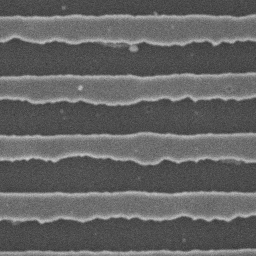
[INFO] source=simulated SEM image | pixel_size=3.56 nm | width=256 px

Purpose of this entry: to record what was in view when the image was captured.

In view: lines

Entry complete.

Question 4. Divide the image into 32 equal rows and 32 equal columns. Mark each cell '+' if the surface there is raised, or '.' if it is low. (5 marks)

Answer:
................................
................................
++++++++++++++++++++++++++++++++
++++++++++++++++++++++++++++++++
++++++++++++++++++++++++++++++++
...................++++.........
................................
................................
................................
..+++++++++++++++..+++++++++++++
++++++++++++++++++++++++++++++++
++++++++++++++++++++++++++++++++
...+++++++++++++++++.+..+.......
................................
................................
................................
................................
++++++++++++++++++++++++++++++++
++++++++++++++++++++++++++++++++
+++++++++..+++++++++++++++++++++
.................+++............
................................
................................
................................
++++++++++++++++++++++++++++++++
++++++++++++++++++++++++++++++++
++++++++++++++++++++++++++++++++
.++++++..++........++.......+...
................................
................................
................................
...++++.++++++..++++++++++++++++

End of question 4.